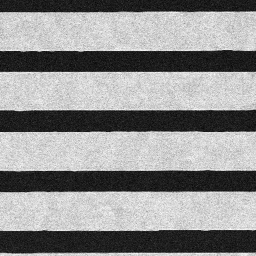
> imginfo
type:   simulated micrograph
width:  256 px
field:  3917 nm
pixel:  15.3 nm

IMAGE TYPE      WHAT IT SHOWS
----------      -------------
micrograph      lines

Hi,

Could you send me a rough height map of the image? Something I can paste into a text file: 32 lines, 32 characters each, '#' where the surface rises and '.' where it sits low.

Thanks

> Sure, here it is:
................................
................................
################################
################################
################################
################################
................................
................................
................................
################################
################################
################################
################################
################################
................................
................................
..............#.#.###..##.....#.
################################
################################
################################
################################
................................
................................
................................
################################
################################
################################
################################
################################
................................
................................
................................